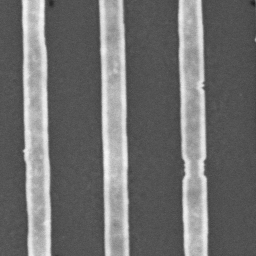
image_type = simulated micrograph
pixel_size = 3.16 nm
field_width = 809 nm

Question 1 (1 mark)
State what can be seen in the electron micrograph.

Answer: one or a few lines or trenches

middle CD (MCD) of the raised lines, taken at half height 63.6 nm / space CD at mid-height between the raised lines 58.5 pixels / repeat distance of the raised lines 248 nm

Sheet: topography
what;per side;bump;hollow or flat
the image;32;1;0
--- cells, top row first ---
00011000000001100000000110000000
00011000000001100000000110000000
00011000000001100000000110000000
00011000000001100000000110000000
00011000000001100000000110000000
00011000000001100000000110000000
00011000000001100000000110000000
00011100000001100000000110000000
00011100000001100000000110000000
00011100000001100000000110000000
00011100000001100000000110000000
00011100000001100000000110000000
00011100000001100000000110000000
00011100000001100000000110000000
00011100000001100000000110000000
00011100000001110000000110000000
00011100000001110000000110000000
00011100000001110000000110000000
00011100000001110000000110000000
00011100000001110000000110000000
00011100000001110000000110000000
00001100000001110000000110000000
00001100000001110000000111000000
00011100000001110000000111000000
00001100000001110000000111000000
00001100000001110000000111000000
00001100000001110000000111000000
00001100000001110000000111000000
00001100000001110000000111000000
00001100000001110000000111000000
00001100000001110000000111000000
00001100000001110000000111000000